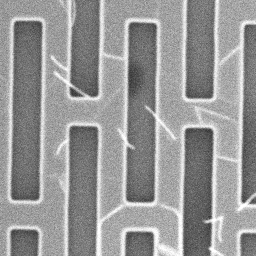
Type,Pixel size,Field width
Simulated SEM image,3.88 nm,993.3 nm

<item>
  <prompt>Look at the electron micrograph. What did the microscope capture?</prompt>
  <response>groups of lines, slits or small figures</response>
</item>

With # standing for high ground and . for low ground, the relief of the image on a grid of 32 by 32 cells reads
#########....##########....#####
#########....##########....#####
##...####....##########....#####
##...####....###....###....###..
##...####....###....###....###..
##...####....###....###....###..
##...####....###....###....###..
##...####....###....###....###..
##...####....###....###....###..
#....####...####....###....###..
#....####...####....###....###..
#....####...####....###....###..
#....###########....####..####..
#....###########....##########..
#....###########....##########..
#....###########....##########..
#....####...####....###....###..
#....####...####....###....###..
#....###....####....###....###..
#....####...####....###....###..
#....####...####....###....###..
#....####...####....###....###..
#....###....####....###....###..
#....###....####....###....###..
#....###....####...####....###..
########....###########....####.
########....###########....#####
########....###########....#####
##..####....###########....#####
#....###....####...####....###..
#....###....###....####....###..
#....###....###....####...####..